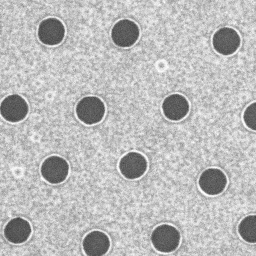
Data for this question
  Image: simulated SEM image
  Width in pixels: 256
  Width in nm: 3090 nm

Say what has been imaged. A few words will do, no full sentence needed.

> a regular array of holes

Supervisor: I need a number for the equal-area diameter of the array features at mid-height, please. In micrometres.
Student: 0.354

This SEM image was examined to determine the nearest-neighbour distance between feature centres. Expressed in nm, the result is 880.